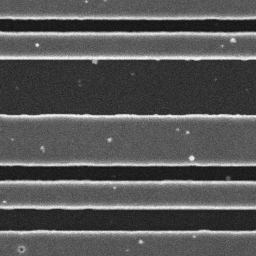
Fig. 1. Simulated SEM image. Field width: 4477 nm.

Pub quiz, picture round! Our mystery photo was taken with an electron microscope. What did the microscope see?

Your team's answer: lines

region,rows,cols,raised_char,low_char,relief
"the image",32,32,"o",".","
oooooooooooooooooooooooooooooooo
oooooooooooooooooooooooooooooooo
................................
................................
oooooooooooooooooooooooooooooooo
oooooooooooooooooooooooooooooooo
oooooooooooooooooooooooooooooooo
................................
................................
................................
................................
................................
................................
................................
oooooooooooooooooooooooooooooooo
oooooooooooooooooooooooooooooooo
oooooooooooooooooooooooooooooooo
oooooooooooooooooooooooooooooooo
oooooooooooooooooooooooooooooooo
oooooooooooooooooooooooooooooooo
oooooooooooooooooooooooooooooooo
................................
................................
oooooooooooooooooooooooooooooooo
oooooooooooooooooooooooooooooooo
oooooooooooooooooooooooooooooooo
................................
................................
................................
oooooooooooooooooooooooooooooooo
oooooooooooooooooooooooooooooooo
oooooooooooooooooooooooooooooooo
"